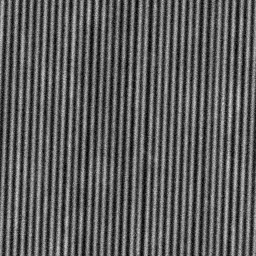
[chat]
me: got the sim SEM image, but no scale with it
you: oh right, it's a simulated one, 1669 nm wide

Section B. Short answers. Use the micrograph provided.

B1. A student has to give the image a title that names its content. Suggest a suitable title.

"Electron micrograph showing parallel lines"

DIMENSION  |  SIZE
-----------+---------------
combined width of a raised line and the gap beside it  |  0.0473 microns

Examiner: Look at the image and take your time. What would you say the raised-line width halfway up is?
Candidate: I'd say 12.2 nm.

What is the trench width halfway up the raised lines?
0.0358 µm